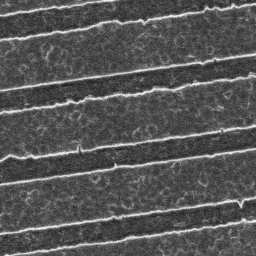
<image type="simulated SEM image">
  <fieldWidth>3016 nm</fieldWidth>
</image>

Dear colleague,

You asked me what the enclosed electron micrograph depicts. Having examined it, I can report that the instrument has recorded one or a few lines or trenches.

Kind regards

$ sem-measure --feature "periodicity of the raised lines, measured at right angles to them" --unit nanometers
841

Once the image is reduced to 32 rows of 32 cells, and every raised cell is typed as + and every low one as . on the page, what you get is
+++++++++++.....................
++++.....................+++++++
...................+++++++++++++
...........+++++++++++++++++++++
....++++++++++++++++++++++++++++
++++++++++++++++++++++++++++++++
++++++++++++++++++++++++++++++++
+++++++++++++++++++++++++++.....
++++++++++++++++++++............
+++++++++++++...................
++++++..................++++++++
..................++++++++++++++
..........++++++++++++++++++++++
....++++++++++++++++++++++++++++
++++++++++++++++++++++++++++++++
++++++++++++++++++++++++++++++++
+++++++++++++++++++++++++++.....
++++++++++++++++++++............
++++++++++++....................
++++++...................+++++++
..................++++++++++++++
...........+++++++++++++++++++++
....++++++++++++++++++++++++++++
++++++++++++++++++++++++++++++++
++++++++++++++++++++++++++++++++
+++++++++++++++++++++++++++.....
++++++++++++++++++++............
+++++++++++++...................
++++++...................+++++++
..................++++++++++++++
............++++++++++++++++++++
....++++++++++++++++++++++++++++